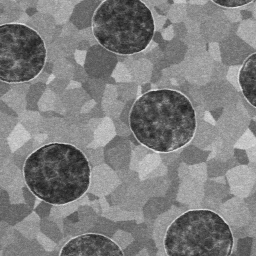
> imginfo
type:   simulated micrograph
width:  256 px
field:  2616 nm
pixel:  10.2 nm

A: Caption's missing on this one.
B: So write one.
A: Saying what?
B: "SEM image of holes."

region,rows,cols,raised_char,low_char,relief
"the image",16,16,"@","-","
@@@@@@---@@@@@@@
@@@@@@----@@@@@@
---@@@---@@@@@@@
---@@@@@@@@@@@@@
--@@@@@@@@@@@@@-
@@@@@@@@@@@@@@@-
@@@@@@@@----@@@@
@@@@@@@@----@@@@
@@@@@@@@----@@@@
@@---@@@@@@@@@@@
@@----@@@@@@@@@@
@@----@@@@@@@@@@
@@@--@@@@@@@@@@@
@@@@@@@@@@@---@@
@@@@@@@@@@----@@
@@@@---@@@----@@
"